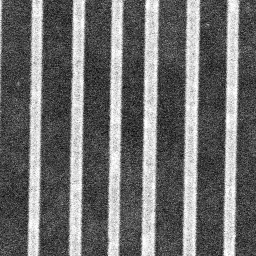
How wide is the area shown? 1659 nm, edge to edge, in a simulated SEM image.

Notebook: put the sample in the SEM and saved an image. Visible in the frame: parallel lines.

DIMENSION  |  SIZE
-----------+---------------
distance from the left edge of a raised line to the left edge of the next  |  254 nm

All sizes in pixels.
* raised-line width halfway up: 10.1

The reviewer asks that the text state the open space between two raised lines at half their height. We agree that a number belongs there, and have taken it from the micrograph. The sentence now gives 189 nanometers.